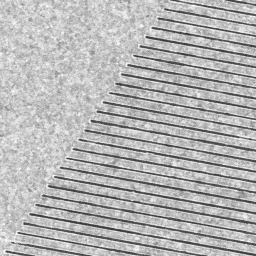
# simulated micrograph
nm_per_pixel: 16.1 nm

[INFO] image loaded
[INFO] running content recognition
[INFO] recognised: parallel lines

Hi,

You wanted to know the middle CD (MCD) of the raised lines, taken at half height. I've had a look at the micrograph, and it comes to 0.121 micrometres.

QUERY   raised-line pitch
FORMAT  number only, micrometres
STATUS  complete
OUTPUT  0.165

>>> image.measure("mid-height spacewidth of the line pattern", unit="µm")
0.0417